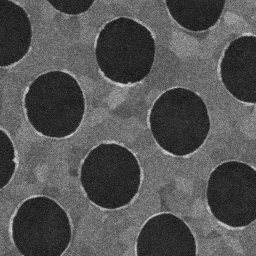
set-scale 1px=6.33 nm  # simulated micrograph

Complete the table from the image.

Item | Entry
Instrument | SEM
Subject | holes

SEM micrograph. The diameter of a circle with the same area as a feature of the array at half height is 404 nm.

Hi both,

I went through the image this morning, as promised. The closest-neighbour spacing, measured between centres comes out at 557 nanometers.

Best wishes